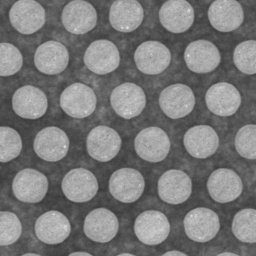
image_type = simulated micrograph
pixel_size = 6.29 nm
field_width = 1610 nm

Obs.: a regular array of raised bodies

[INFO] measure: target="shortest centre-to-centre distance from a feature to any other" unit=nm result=295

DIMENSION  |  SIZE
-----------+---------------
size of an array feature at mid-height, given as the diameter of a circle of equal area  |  222 nanometers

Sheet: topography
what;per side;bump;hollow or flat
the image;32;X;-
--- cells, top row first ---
--XXX----XX---XXX---XXXX--XXXX--
-XXXXX--XXXX--XXXX--XXXX--XXXX--
-XXXXX--XXXX--XXXX--XXXX--XXXX--
--XXX---XXXX--XXX----XXX---XXX--
--------------------------------
X----XXX---XXX----XX----XXX---XX
XX--XXXXX--XXXX--XXXX--XXXX--XXX
XXX-XXXXX-XXXXX--XXXX--XXXXX-XXX
XXX--XXX---XXXX--XXXX---XXX---XX
--------------------------------
---------X-----XX-----X----XX---
--XXX---XXXX--XXXX--XXXX--XXXX--
--XXXX--XXXX--XXXX--XXXX--XXXX--
--XXXX--XXXX--XXXX--XXXX--XXXX--
--XXX----XX----XX----XX---------
--------------------------------
XX---XXX---XXXX---XXX--XXXX---XX
XXX-XXXXX--XXXX--XXXX--XXXX--XXX
XXX-XXXXX--XXXX--XXXX--XXXX--XXX
XX---XXX---XXX---XXXX---XX----XX
--------------------------------
--XXX----XX---XXX----XX----XX---
--XXXX--XXXX--XXXX--XXXX--XXXX--
--XXXX--XXXX--XXXX--XXXX--XXXX--
--XXXX--XXXX--XXX---XXXX--XXXX--
--------------------------------
X-----X----XXX----XX----XXX---XX
XX---XXX---XXXX--XXXX--XXXX--XXX
XXX-XXXXX-XXXXX--XXXX--XXXX--XXX
XX---XXX---XXX---XXXX---XXX--XXX
X-----------------XX------------
---------XX----------XX---------